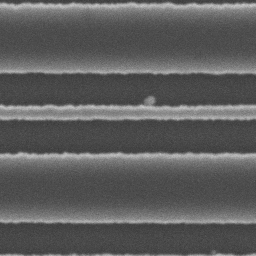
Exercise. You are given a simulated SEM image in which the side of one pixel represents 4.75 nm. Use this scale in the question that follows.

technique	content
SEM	lines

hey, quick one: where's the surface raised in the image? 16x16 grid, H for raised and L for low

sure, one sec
HHHHHHHHHHHHHHHH
HHHHHHHHHHHHHHHH
HHHHHHHHHHHHHHHH
HHHHHHHHHHHHHHHH
HHHHHHHHHHHHHHHH
LLLLLLLLLLLLLLLL
LLLLLLLLLLLLLLLL
LLLLLLLLLLLLLLLL
LLLLLLLLLLLLLLLL
LLLLLLLLLLLLLLLL
HHHHHHHHHHHHHHHH
HHHHHHHHHHHHHHHH
HHHHHHHHHHHHHHHH
HHHHHHHHHHHHHHHH
LLLLLLLLLLLLLLLL
LLLLLLLLLLLLLLLL